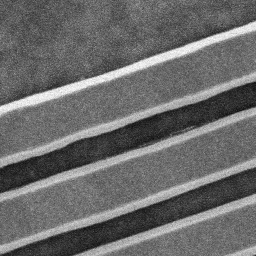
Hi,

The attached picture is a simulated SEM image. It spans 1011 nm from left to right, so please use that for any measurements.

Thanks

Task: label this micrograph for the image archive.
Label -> one or a few lines or trenches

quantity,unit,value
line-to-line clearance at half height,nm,126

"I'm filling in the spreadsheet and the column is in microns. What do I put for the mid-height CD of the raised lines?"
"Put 0.198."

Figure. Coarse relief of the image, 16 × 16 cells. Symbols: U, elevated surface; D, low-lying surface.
DDDDDDDDDDDDDDDD
DDDDDDDDDDDDDDDD
DDDDDDDDDDDDDUUU
DDDDDDDDDDUUUUUU
DDDDDDDDUUUUUUUU
DDDDUUUUUUUUUUDD
DUUUUUUUUUUDDDDD
UUUUUUUUDDDDDDUU
UUUUUDDDDDDDUUUU
UUDDDDDDDUUUUUUU
DDDDDDUUUUUUUUUD
DDUUUUUUUUUUDDDD
UUUUUUUUUUDDDDDD
UUUUUUUDDDDDDUUU
UUUDDDDDDDUUUUUU
DDDDDDDUUUUUUUUU